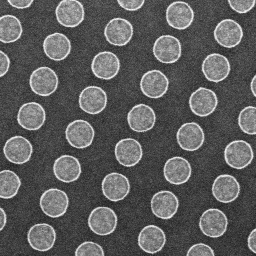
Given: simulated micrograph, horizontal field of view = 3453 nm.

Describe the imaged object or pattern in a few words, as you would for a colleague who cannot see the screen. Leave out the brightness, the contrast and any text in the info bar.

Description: a regular array of raised bodies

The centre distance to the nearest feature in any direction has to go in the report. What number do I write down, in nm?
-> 491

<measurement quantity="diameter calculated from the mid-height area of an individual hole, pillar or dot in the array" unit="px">26.6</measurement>